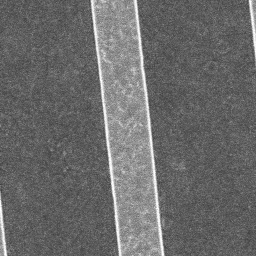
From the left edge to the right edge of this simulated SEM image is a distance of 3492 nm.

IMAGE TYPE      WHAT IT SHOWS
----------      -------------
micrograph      one or a few lines or trenches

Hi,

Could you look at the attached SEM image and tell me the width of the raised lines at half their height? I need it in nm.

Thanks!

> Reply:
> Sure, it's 590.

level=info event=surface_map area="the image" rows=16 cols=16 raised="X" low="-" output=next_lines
------XXX-------
------XXX-------
------XXX-------
------XXX-------
------XXX-------
------XXX-------
------XXX-------
-------XX-------
-------XX-------
-------XXX------
-------XXX------
-------XXX------
-------XXX------
-------XXX------
-------XXX------
-------XXX------